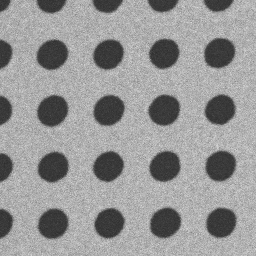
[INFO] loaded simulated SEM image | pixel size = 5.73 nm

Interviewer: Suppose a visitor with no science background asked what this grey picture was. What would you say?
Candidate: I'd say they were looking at a regular array of holes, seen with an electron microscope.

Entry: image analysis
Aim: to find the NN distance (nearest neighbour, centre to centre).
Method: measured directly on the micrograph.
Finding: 319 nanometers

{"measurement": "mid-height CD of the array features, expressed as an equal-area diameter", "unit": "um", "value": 0.172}